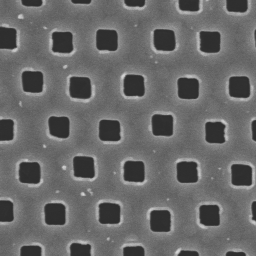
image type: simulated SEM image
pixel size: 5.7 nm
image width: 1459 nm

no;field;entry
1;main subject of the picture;a regular array of holes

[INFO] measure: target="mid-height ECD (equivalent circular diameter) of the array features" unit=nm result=132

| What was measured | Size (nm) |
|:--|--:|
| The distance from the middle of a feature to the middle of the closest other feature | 274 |